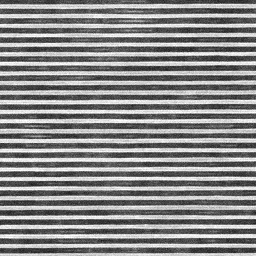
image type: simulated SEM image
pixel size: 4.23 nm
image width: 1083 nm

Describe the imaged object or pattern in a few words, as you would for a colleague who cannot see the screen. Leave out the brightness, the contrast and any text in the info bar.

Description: parallel lines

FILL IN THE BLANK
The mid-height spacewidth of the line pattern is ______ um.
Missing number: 0.0254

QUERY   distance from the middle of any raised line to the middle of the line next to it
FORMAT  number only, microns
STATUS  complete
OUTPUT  0.0406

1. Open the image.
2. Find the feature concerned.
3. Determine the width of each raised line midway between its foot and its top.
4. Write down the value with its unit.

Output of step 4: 3.5 pixels